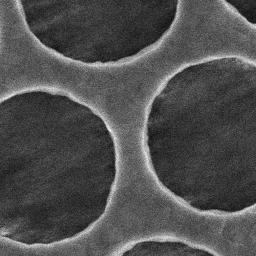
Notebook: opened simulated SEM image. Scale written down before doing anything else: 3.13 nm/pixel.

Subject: holes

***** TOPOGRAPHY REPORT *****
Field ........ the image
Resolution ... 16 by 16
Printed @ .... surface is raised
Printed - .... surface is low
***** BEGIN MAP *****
@----------@@@@-
@@---------@@@@@
@@--------@@@@@@
@@@@-----@@@@@@@
@@@@@@@@@@@-----
@@@@@@@@@@------
-----@@@@-------
------@@@-------
-------@@-------
-------@@-------
-------@@@------
-------@@@------
-------@@@@-----
------@@@@@@@@@@
-----@@@@@@@@@@@
@@@@@@@@----@@@@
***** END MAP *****